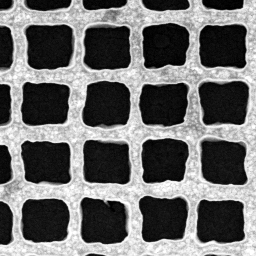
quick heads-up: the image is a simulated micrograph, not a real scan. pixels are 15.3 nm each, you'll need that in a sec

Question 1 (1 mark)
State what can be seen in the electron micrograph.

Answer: a regular array of holes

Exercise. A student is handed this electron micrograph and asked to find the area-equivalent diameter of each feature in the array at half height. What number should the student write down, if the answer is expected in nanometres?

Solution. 761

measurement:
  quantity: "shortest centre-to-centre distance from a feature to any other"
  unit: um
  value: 0.879